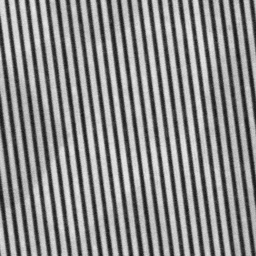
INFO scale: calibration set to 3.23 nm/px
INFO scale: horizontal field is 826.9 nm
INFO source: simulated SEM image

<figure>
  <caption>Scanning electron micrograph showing parallel lines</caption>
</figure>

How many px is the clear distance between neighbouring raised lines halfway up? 5.08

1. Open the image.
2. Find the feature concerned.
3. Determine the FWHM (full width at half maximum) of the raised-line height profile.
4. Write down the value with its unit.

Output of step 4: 16.4 nm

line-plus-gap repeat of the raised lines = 10.1 px